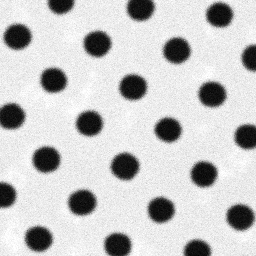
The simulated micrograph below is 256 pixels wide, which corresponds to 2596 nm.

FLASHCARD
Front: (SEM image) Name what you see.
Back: a regular array of holes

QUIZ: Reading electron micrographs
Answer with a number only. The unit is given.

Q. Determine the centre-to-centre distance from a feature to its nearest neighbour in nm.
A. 567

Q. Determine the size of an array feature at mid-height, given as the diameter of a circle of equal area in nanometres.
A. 290